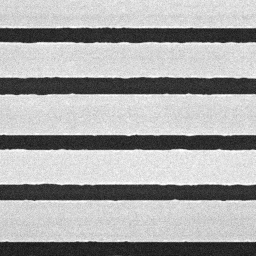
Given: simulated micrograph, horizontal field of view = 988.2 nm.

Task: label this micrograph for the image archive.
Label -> lines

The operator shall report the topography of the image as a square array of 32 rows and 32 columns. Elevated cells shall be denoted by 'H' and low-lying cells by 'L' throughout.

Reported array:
HHHHHHHHHHHHHHHHHHHHHHHHHHHHHHHH
HHHHHHHHHHHHHHHHHHHHHHHHHHHHHHHH
HHHHHHHHHHHHHHHHHHHHHHHHHHHHHHHH
LLLLLLLLLLLLLLLLLLLLLLLLLLLLLLLL
LLLLLLLLLLLLLLLLLLLLLLLLLLLLLLLL
HHHHHHHHHHHHHHHHHHHHHHHHHHHHHHHH
HHHHHHHHHHHHHHHHHHHHHHHHHHHHHHHH
HHHHHHHHHHHHHHHHHHHHHHHHHHHHHHHH
HHHHHHHHHHHHHHHHHHHHHHHHHHHHHHHH
HHHHHHHHHHHHHHHHHHHHHHHHHHHHHHHH
LLLLLLLLLLLLLLLLLLLLLLLLLLLLLLLL
LLLLLLLLLLLLLLLLLLLLLLLLLLLLLLLL
HHHHHHHHHHHHHHHHHHHHHHHHHHHHHHHH
HHHHHHHHHHHHHHHHHHHHHHHHHHHHHHHH
HHHHHHHHHHHHHHHHHHHHHHHHHHHHHHHH
HHHHHHHHHHHHHHHHHHHHHHHHHHHHHHHH
HHHHHHHHHHHHHHHHHHHHHHHHHHHHHHHH
LLLLLLLLLLLLLLLLLLLLLLLLLLLLLLLL
LLLLLLLLLLLLLLLLLLLLLLLLLLLLLLLL
HHHHHHHHHHHHHHHHHHHHHHHHHHHHHHHH
HHHHHHHHHHHHHHHHHHHHHHHHHHHHHHHH
HHHHHHHHHHHHHHHHHHHHHHHHHHHHHHHH
HHHHHHHHHHHHHHHHHHHHHHHHHHHHHHHH
LLLLLLLLLLLLLLLLLLLLLLLLLLLLLLLL
LLLLLLLLLLLLLLLLLLLLLLLLLLLLLLLL
HHHHHHHHHHHHHHHHHHHHHHHHHHHHHHHH
HHHHHHHHHHHHHHHHHHHHHHHHHHHHHHHH
HHHHHHHHHHHHHHHHHHHHHHHHHHHHHHHH
HHHHHHHHHHHHHHHHHHHHHHHHHHHHHHHH
HHHHHHHHHHHHHHHHHHHHHHHHHHHHHHHH
LLLLLLLLLLLLLLLLLLLLLLLLLLLLLLLL
LLLLLLLLLLLLLLLLLLLLLLLLLLLLLLLL